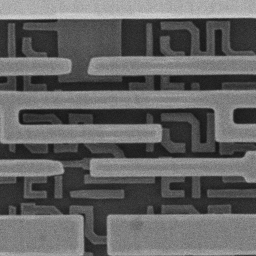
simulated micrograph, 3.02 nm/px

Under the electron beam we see wiring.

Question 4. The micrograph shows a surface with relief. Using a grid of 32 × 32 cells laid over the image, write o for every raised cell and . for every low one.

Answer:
oooooooooooooooooooooooooooooooo
oooooooooooooooooooooooooooooooo
................................
................................
................................
................................
................................
ooooooooo...oooooooooooooooooooo
ooooooooo..ooooooooooooooooooooo
................................
................................
oooooooooooooooooooooooooooooooo
oooooooooooooooooooooooooooooooo
oooooooooooooooooooooooo..oooo..
oo.........................oo...
ooo........................ooo..
oooooooooooooooooooo.......ooooo
oooooooooooooooooooo.......ooooo
................................
..............................oo
oooooooo...ooooooooooooooooooooo
oooooooo...ooooooooooooooooooooo
...............................o
................................
................................
................................
................................
oooooooooo...ooooooooooooooooooo
oooooooooo...ooooooooooooooooooo
oooooooooo...ooooooooooooooooooo
oooooooooo...ooooooooooooooooooo
oooooooooo...ooooooooooooooooooo